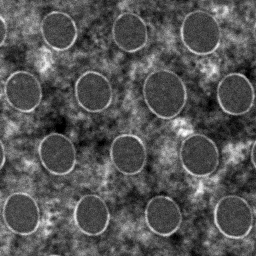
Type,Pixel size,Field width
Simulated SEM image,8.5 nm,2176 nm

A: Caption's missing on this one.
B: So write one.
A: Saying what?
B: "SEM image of a regular array of raised bodies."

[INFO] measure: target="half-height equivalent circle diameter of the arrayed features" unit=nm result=323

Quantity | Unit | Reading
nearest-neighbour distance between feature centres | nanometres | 598